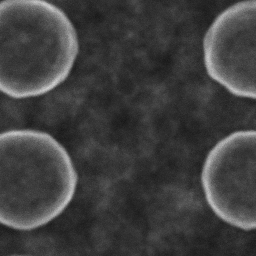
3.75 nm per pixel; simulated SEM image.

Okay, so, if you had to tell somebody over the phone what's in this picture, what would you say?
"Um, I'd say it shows raised bodies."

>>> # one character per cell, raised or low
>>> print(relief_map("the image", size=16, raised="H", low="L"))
HHHLLLLLLLLLLLLH
HHHHLLLLLLLLLLHH
HHHHHLLLLLLLLHHH
HHHHLLLLLLLLLHHH
HHHHLLLLLLLLLHHH
HHHLLLLLLLLLLLHH
LLLLLLLLLLLLLLLL
LLLLLLLLLLLLLLLL
HHHLLLLLLLLLLLLH
HHHHLLLLLLLLLHHH
HHHHLLLLLLLLLHHH
HHHHHLLLLLLLLHHH
HHHHLLLLLLLLLHHH
HHHLLLLLLLLLLLHH
LLLLLLLLLLLLLLLL
LLLLLLLLLLLLLLLL